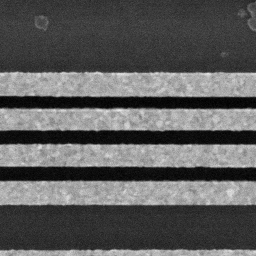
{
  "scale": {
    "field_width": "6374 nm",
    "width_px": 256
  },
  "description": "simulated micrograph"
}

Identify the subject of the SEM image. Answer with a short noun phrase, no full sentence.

lines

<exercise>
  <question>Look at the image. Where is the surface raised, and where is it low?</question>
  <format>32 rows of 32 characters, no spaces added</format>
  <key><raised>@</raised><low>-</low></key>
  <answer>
--------------------------------
--------------------------------
--------------------------------
--------------------------------
--------------------------------
--------------------------------
--------------------------------
--------------------------------
--------------------------------
@@@@@@@@@@@@@@@@@@@@@@@@@@@@@@@@
@@@@@@@@@@@@@@@@@@@@@@@@@@@@@@@@
@@@@@@@@@@@@@@@@@@@@@@@@@@@@@@@@
--------------------------------
--------------------------------
@@@@@@@@@@@@@@@@@@@@@@@@@@@@@@@@
@@@@@@@@@@@@@@@@@@@@@@@@@@@@@@@@
--------------------------------
--------------------------------
@@@@@@@@@@@@@@@@@@@@@@@@@@@@@@@@
@@@@@@@@@@@@@@@@@@@@@@@@@@@@@@@@
@@@@@@@@@@@@@@@@@@@@@@@@@@@@@@@@
--------------------------------
--------------------------------
@@@@@@@@@@@@@@@@@@@@@@@@@@@@@@@@
@@@@@@@@@@@@@@@@@@@@@@@@@@@@@@@@
@@@@@@@@@@@@@@@@@@@@@@@@@@@@@@@@
--------------------------------
--------------------------------
--------------------------------
--------------------------------
--------------------------------
@@@@@@@@@@@@@@@@@@@@@@@@@@@@@@@@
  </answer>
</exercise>